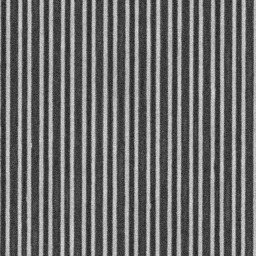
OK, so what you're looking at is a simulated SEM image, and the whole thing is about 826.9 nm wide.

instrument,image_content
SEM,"parallel lines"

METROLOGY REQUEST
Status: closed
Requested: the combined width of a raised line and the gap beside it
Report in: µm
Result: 0.0346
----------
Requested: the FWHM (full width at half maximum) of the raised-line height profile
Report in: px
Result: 3.5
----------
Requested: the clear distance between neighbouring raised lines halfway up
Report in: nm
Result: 23.9